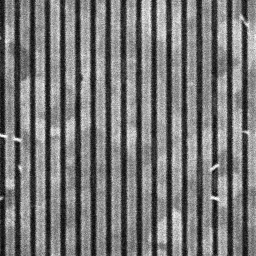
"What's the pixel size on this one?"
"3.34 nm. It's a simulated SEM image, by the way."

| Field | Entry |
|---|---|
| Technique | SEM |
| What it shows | parallel lines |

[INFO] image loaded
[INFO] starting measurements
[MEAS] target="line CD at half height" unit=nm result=28.4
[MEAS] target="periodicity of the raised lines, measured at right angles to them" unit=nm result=50.6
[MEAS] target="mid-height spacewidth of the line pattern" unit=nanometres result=22.5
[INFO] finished